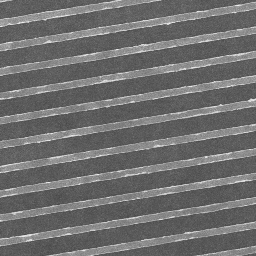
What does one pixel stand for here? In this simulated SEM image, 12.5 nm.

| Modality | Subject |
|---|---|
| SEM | parallel lines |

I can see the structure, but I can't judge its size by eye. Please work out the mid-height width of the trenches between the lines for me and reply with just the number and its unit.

216 nm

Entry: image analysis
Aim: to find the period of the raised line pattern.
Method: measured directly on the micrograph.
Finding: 300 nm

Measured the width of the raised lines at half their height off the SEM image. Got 87.8 nm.